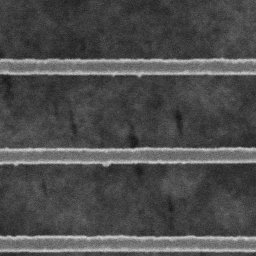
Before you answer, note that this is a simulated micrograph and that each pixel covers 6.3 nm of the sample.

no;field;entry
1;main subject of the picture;lines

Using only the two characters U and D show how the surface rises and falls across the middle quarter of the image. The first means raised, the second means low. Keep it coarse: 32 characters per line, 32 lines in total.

UUUUUUUUUUUUUUUUUUUUUUUUUUUUUUUU
UUUUUUUUUUUUUUUUUUUUUUUUUUUUUUUU
DDDDDDDDDDDDDDDDDDDDDDDDDDDDDDDD
DDDDDDDDDDDDDDDDDDDDDDDDDDDDDDDD
DDDDDDDDDDDDDDDDDDDDDDDDDDDDDDDD
DDDDDDDDDDDDDDDDDDDDDDDDDDDDDDDD
DDDDDDDDDDDDDDDDDDDDDDDDDDDDDDDD
DDDDDDDDDDDDDDDDDDDDDDDDDDDDDDDD
DDDDDDDDDDDDDDDDDDDDDDDDDDDDDDDD
DDDDDDDDDDDDDDDDDDDDDDDDDDDDDDDD
DDDDDDDDDDDDDDDDDDDDDDDDDDDDDDDD
DDDDDDDDDDDDDDDDDDDDDDDDDDDDDDDD
DDDDDDDDDDDDDDDDDDDDDDDDDDDDDDDD
DDDDDDDDDDDDDDDDDDDDDDDDDDDDDDDD
DDDDDDDDDDDDDDDDDDDDDDDDDDDDDDDD
DDDDDDDDDDDDDDDDDDDDDDDDDDDDDDDD
DDDDDDDDDDDDDDDDDDDDDDDDDDDDDDDD
DDDDDDDDDDDDDDDDDDDDDDDDDDDDDDDD
DDDDDDDDDDDDDDDDDDDDDDDDDDDDDDDD
DDDDDDDDDDDDDDDDDDDDDDDDDDDDDDDD
DDDDDDDDDDDDDDDDDDDDDDDDDDDDDDDD
UUUDUUUDDDDUUDDUUUUUUUUUUUUUUUUU
UUUUUUUUUUUUUUUUUUUUUUUUUUUUUUUU
UUUUUUUUUUUUUUUUUUUUUUUUUUUUUUUU
UUUUUUUUUUUUUUUUUUUUUUUUUUUUUUUU
DDDDDDDDDDDDDDDDDDDDDDDDDDDDDDDD
DDDDDDDDDDDDDDDDDDDDDDDDDDDDDDDD
DDDDDDDDDDDDDDDDDDDDDDDDDDDDDDDD
DDDDDDDDDDDDDDDDDDDDDDDDDDDDDDDD
DDDDDDDDDDDDDDDDDDDDDDDDDDDDDDDD
DDDDDDDDDDDDDDDDDDDDDDDDDDDDDDDD
DDDDDDDDDDDDDDDDDDDDDDDDDDDDDDDD